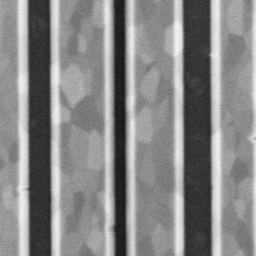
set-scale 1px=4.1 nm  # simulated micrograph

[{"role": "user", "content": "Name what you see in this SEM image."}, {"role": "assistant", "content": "one or a few lines or trenches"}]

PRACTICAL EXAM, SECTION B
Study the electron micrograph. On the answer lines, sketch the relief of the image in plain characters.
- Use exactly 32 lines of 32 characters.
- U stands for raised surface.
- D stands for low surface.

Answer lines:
UUUDDDDUUUUUUUDDUUUUUUDDDDDUUUUU
UUUDDDDUUUUUUUDDUUUUUUDDDDDUUUUU
UUUDDDDUUUUUUUDDUUUUUUDDDDDUUUUU
UUUDDDDUUUUUUUDDUUUUUUDDDDDUUUUU
UUUDDDDUUUUUUUDDUUUUUUDDDDDUUUUU
UUUDDDDUUUUUUUDDUUUUUUDDDDDUUUUU
UUUDDDDUUUUUUUDDUUUUUUDDDDDUUUUU
UUUDDDDUUUUUUUDDUUUUUUDDDDDUUUUU
UUUDDDDUUUUUUUDDUUUUUUDDDDDUUUUU
UUUDDDDUUUUUUUDDUUUUUUDDDDDUUUUU
UUUDDDDUUUUUUUDDUUUUUUDDDDDUUUUU
UUUDDDDUUUUUUUDDUUUUUUDDDDDUUUUU
UUUDDDDUUUUUUUDDUUUUUUDDDDDUUUUU
UUUDDDDUUUUUUUDDUUUUUUDDDDDUUUUU
UUUDDDDUUUUUUUDDUUUUUUDDDDDUUUUU
UUUDDDDUUUUUUUDDUUUUUUDDDDDUUUUU
UUUDDDDUUUUUUUDDUUUUUUDDDDDUUUUU
UUUDDDDUUUUUUUDDUUUUUUDDDDDUUUUU
UUUDDDDUUUUUUUDDUUUUUUDDDDDUUUUU
UUUDDDDUUUUUUUDDUUUUUUDDDDDUUUUU
UUUDDDDUUUUUUUDDUUUUUUDDDDDUUUUU
UUUDDDDUUUUUUUDDUUUUUUDDDDDUUUUU
UUUDDDDUUUUUUUDDUUUUUUDDDDDUUUUU
UUUDDDDUUUUUUUDDUUUUUUDDDDDUUUUU
UUUDDDDUUUUUUUDDUUUUUUDDDDDUUUUU
UUUDDDDUUUUUUUDDUUUUUUDDDDDUUUUU
UUUDDDDUUUUUUUDDUUUUUUDDDDDUUUUU
UUUDDDDUUUUUUUDDUUUUUUDDDDDUUUUU
UUUDDDDUUUUUUUDDUUUUUUDDDDDUUUUU
UUUDDDDUUUUUUUDDUUUUUUDDDDDUUUUU
UUUDDDDUUUUUUUDDUUUUUUDDDDDUUUUU
UUUDDDDUUUUUUUDDUUUUUUUDDDDUUUUU